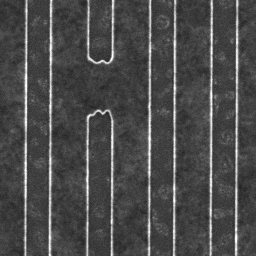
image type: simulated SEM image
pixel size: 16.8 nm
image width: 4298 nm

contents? parallel lines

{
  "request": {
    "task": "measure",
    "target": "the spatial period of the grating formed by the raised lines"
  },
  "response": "1040 nanometres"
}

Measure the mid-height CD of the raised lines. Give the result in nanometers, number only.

632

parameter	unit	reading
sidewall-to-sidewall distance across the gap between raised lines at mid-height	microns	0.415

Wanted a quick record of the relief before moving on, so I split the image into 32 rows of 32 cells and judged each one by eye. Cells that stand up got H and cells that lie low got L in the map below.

HHHLLLHHHHHLLLHHHHHLLLHHHHLLLLHH
HHHLLLHHHHHLLLHHHHHLLLHHHHLLLLHH
HHHLLLHHHHHLLLHHHHHLLLHHHHLLLLHH
HHHLLLHHHHHLLLHHHHHLLLHHHHLLLLHH
HHHLLLHHHHHLLLHHHHHLLLHHHHLLLLHH
HHHLLLHHHHHLLLHHHHHLLLHHHHLLLLHH
HHHLLLHHHHHLLLHHHHHLLLHHHHLLLLHH
HHHLLLHHHHHLLLHHHHHLLLHHHHLLLLHH
HHHLLLHHHHHHHHHHHHHLLLHHHHLLLLHH
HHHLLLHHHHHHHHHHHHHLLLHHHHLLLLHH
HHHLLLHHHHHHHHHHHHHLLLHHHHLLLLHH
HHHLLLHHHHHHHHHHHHHLLLHHHHLLLLHH
HHHLLLHHHHHHHHHHHHHLLLHHHHLLLLHH
HHHLLLHHHHHHHHHHHHHLLLHHHHLLLLHH
HHHLLLHHHHHLLLHHHHHLLLHHHHLLLLHH
HHHLLLHHHHHLLLHHHHHLLLHHHHLLLLHH
HHHLLLHHHHHLLLHHHHHLLLHHHHLLLLHH
HHHLLLHHHHHLLLHHHHHLLLHHHHLLLLHH
HHHLLLHHHHHLLLHHHHHLLLHHHHLLLLHH
HHHLLLHHHHHLLLHHHHHLLLHHHHLLLLHH
HHHLLLHHHHHLLLHHHHHLLLHHHHLLLLHH
HHHLLLHHHHHLLLHHHHHLLLHHHHLLLLHH
HHHLLLHHHHHLLLHHHHHLLLHHHHLLLLHH
HHHLLLHHHHHLLLHHHHHLLLHHHHLLLLHH
HHHLLLHHHHHLLLHHHHHLLLHHHHLLLLHH
HHHLLLHHHHHLLLHHHHHLLLHHHHLLLLHH
HHHLLLHHHHHLLLHHHHHLLLHHHHLLLLHH
HHHLLLHHHHHLLLHHHHHLLLHHHHLLLLHH
HHHLLLHHHHHLLLHHHHHLLLHHHHLLLLHH
HHHLLLHHHHHLLLHHHHHLLLHHHHLLLLHH
HHHLLLHHHHHLLLHHHHHLLLHHHHLLLLHH
HHHLLLHHHHHLLLHHHHHLLLHHHHLLLLHH